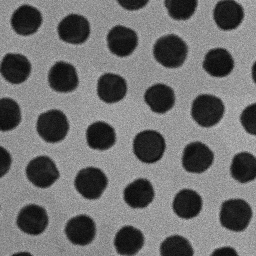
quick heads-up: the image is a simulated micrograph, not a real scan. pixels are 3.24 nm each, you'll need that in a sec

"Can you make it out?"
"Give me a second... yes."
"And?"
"a regular array of holes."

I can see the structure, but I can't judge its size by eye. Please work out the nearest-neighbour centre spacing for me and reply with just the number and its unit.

0.156 microns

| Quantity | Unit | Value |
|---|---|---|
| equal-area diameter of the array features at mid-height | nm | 104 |